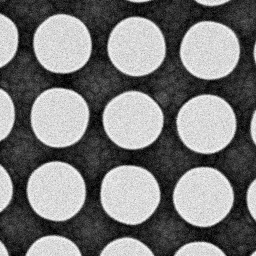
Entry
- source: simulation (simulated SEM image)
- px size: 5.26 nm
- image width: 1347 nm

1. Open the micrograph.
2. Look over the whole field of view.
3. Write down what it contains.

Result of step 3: an array of small figures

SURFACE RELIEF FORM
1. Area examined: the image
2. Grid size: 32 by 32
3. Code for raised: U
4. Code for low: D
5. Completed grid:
DDDDDDDDDDDDDDDDDDDDDDDDDUUUDDDD
DDDDDDDDDDDDDDDDDDDDDDDDDDDDDDDD
UDDDDDUUUUDDDDDDUUDDDDDDDDDDDDDD
UUDDDUUUUUUDDDUUUUUUDDDDUUUUDDDD
UUDDUUUUUUUDDDUUUUUUDDDUUUUUUDDD
UUDDUUUUUUUDDDUUUUUUUDDUUUUUUUDD
UUDDUUUUUUUDDDUUUUUUUDDUUUUUUUDD
UDDDDUUUUUUDDDUUUUUUDDDUUUUUUUDD
DDDDDDUUUUDDDDDUUUUUDDDUUUUUUDDD
DDDDDDDDDDDDDDDDDDDDDDDDDUUUDDDD
DDDDDDDDDDDDDDDDDDDDDDDDDDDDDDDD
UDDDDDUUUDDDDDDDUUDDDDDDDDDDDDDD
UDDDDUUUUUDDDDUUUUUDDDDDUUUUDDDD
UUDDUUUUUUUDDUUUUUUUDDDUUUUUUDDD
UUDDUUUUUUUDDUUUUUUUDDUUUUUUUDDD
UUDDUUUUUUUDDUUUUUUUDDUUUUUUUDDU
UDDDUUUUUUDDDUUUUUUUDDUUUUUUUDDU
DDDDDUUUUUDDDDUUUUUDDDDUUUUUUDDD
DDDDDDDDDDDDDDDDUDDDDDDDUUUUDDDD
DDDDDDDDDDDDDDDDDDDDDDDDDDDDDDDD
DDDDDDUUDDDDDDDDDDDDDDDDDDDDDDDD
UDDDUUUUUUDDDDUUUUUDDDDUUUUDDDDD
UDDDUUUUUUDDDUUUUUUDDDUUUUUUDDDD
UUDDUUUUUUUDDUUUUUUUDDUUUUUUUDDU
UDDUUUUUUUUDDUUUUUUUDDUUUUUUUDDU
UDDDUUUUUUDDDUUUUUUUDDUUUUUUUDDU
DDDDDUUUUUDDDUUUUUUDDDUUUUUUUDDU
DDDDDDDUDDDDDDDUUUDDDDDUUUUUDDDD
DDDDDDDDDDDDDDDDDDDDDDDDDDDDDDDD
DDDDDDUDDDDDDDDDDDDDDDDDDDDDDDDD
DDDDUUUUUDDDDDUUUUDDDDDDUUDDDDDD
UDDUUUUUUUDDDUUUUUUDDDUUUUUUDDDD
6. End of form